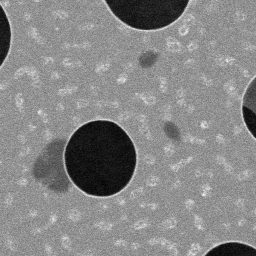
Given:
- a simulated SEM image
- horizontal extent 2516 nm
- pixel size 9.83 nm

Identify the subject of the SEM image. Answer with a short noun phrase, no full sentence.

holes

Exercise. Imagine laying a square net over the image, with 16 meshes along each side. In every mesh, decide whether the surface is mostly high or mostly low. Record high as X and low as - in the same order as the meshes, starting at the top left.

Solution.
XXXXXXX-----XXXX
-XXXXXXX---XXXXX
-XXXXXXXXXXXXXXX
XXXXXXXXXXXXXXXX
XXXXXXXXXXXXXXXX
XXXXXXXXXXXXXXX-
XXXXXXXXXXXXXXX-
XXXXXXXXXXXXXXX-
XXXXX---XXXXXXXX
XXXX----XXXXXXXX
XXXX----XXXXXXXX
XXXXX---XXXXXXXX
XXXXXXXXXXXXXXXX
XXXXXXXXXXXXXXXX
XXXXXXXXXXXXXXXX
XXXXXXXXXXXXX---